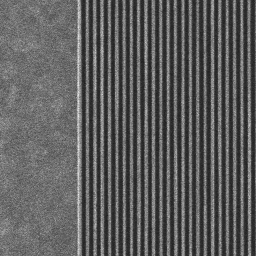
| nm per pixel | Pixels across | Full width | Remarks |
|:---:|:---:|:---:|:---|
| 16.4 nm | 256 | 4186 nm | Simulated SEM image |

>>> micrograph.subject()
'parallel lines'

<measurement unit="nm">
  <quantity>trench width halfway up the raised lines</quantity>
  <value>73.6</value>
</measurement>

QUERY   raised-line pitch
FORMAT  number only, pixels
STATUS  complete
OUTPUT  7.37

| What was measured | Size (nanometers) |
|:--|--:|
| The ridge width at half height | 57.2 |